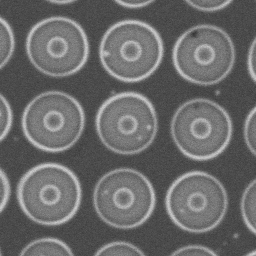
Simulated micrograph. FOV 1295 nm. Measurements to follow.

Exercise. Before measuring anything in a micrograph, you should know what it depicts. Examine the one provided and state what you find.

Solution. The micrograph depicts an array of small figures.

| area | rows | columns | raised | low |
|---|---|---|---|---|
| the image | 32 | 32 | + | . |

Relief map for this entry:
++++++++++++++++..++++++....++++
++++++++++++++++++++++++++++++++
++++++..++++++++++++++++++++++++
.++++.....++++.....++++++.++++++
.+++......+++.......+++.....++++
..++.......++.......++.......+++
.+++.......++.......++.......++.
.+++......+++.......++.......++.
+++++.....+++......+++.......++.
+++++++++++++++...+++++.....++++
++++++++++++++++++++++++++++++++
++++++++++++++++++++++++++++++++
++++.....+++++....++++++++++++++
.+++......+++......++++....+++++
.++.......++.......+++......+++.
.++.......++.......+++.......++.
.++.......++.......+++.......++.
++++.....++++......+++......+++.
++++++..++++++....+++++.....+++.
++++++++++++++++++++++++..++++++
++++++++++++++++++++++++++++++++
++++.....++++++..+++++++++++++++
.++......++++.....+++++....+++++
.++.......++.......+++......+++.
.++.......++.......++.......+++.
+++.......++.......++.......++..
+++......+++.......++.......++..
+++++...+++++.....++++.....++++.
+++++++++++++++++++++++...++++++
++++++++++++++++++++++++++++++++
++++....++++++++++++++++++++++++
+++......++++....+++++....++++++